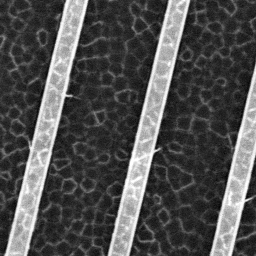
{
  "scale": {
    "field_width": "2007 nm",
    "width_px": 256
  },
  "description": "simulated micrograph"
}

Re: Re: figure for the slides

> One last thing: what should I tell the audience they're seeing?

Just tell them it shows one or a few lines or trenches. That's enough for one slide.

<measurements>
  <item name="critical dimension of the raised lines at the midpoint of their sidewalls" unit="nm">142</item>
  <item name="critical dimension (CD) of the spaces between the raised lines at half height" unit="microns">0.64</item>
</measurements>